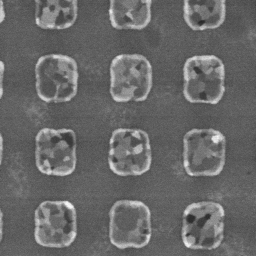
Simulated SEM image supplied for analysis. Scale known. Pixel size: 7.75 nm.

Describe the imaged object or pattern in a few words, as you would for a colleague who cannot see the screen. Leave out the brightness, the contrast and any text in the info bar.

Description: a regular array of raised bodies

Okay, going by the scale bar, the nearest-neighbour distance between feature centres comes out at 562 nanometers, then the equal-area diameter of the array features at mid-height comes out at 44.8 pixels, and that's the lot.